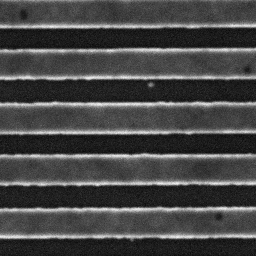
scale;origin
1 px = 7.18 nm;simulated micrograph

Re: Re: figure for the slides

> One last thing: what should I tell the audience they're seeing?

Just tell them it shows lines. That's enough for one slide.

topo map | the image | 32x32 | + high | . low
++++++++++++++++++++++++++++++++
++++++++++++++++++++++++++++++++
++++++++++++++++++++++++++++++++
................................
................................
................................
++++++++++++++++++++++++++++++++
++++++++++++++++++++++++++++++++
++++++++++++++++++++++++++++++++
++++++++++++++++++++++++++++++++
................................
................................
................................
++++++++++++++++++++++++++++++++
++++++++++++++++++++++++++++++++
++++++++++++++++++++++++++++++++
++++++++++++++++++++++++++++++++
................................
................................
++++++++++++++++++++++++++++++++
++++++++++++++++++++++++++++++++
++++++++++++++++++++++++++++++++
++++++++++++++++++++++++++++++++
................................
................................
................................
++++++++++++++++++++++++++++++++
++++++++++++++++++++++++++++++++
++++++++++++++++++++++++++++++++
++++++++++++++++++++++++++++++++
................................
................................